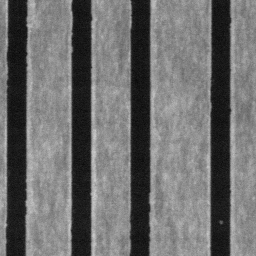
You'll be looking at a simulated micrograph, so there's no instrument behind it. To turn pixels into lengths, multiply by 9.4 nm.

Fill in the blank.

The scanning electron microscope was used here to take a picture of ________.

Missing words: lines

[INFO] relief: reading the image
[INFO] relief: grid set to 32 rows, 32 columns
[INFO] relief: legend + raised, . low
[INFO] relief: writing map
+...+++++...++++...+++++++...+++
+...+++++...++++...+++++++...+++
+...+++++...++++...+++++++...+++
+...+++++...++++...+++++++...+++
+...+++++...++++...+++++++...+++
+...+++++...++++...+++++++...+++
+...+++++...++++...+++++++...+++
+...+++++...++++...+++++++...+++
+...+++++...++++...+++++++...+++
+...+++++...++++...+++++++...+++
+...+++++...++++...+++++++...+++
+...+++++...++++...+++++++...+++
+...+++++...++++...+++++++...+++
+...+++++...++++...+++++++...+++
+...+++++...++++...+++++++...+++
+...+++++...++++...+++++++...+++
+...+++++...++++...+++++++...+++
+...+++++...++++...+++++++...+++
+...+++++...++++...+++++++...+++
+...+++++...++++...+++++++...+++
+...+++++..+++++...+++++++...+++
+...+++++...++++...+++++++...+++
+...+++++...++++...+++++++...+++
+...+++++...++++...+++++++...+++
+...+++++..+++++...+++++++...+++
+...+++++...++++...+++++++...+++
+...+++++...++++...+++++++...+++
+...+++++...++++...+++++++...+++
+...+++++...++++...+++++++...+++
+...+++++...++++...+++++++...+++
+...+++++..+++++...+++++++...+++
+..++++++...++++...+++++++...+++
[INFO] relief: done